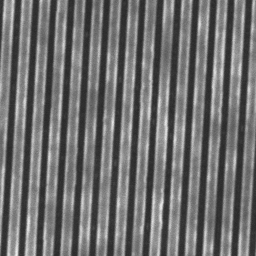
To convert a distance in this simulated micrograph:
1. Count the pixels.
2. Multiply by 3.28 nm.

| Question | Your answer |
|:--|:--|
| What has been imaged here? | parallel lines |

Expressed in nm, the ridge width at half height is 33.9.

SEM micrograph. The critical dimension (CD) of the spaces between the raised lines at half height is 0.0217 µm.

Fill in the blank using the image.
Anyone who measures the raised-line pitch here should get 58.1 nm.